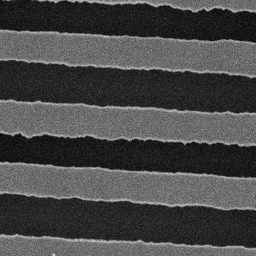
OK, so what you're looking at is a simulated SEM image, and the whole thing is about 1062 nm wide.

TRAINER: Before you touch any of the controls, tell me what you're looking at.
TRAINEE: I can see lines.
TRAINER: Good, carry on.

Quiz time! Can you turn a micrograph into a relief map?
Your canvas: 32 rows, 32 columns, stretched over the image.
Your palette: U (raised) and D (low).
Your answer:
DDDDDDDDDDDDDDDDDDUUUUUUUUUUUUUU
DDDDDDDDDDDDDDDDDDDDDDDDDDDDDDDD
DDDDDDDDDDDDDDDDDDDDDDDDDDDDDDDD
DDDDDDDDDDDDDDDDDDDDDDDDDDDDDDDD
UUUUUUUUUUUUUDDDDDDDDDDDDDDDDDDD
UUUUUUUUUUUUUUUUUUUUUUUUUUUUUUUU
UUUUUUUUUUUUUUUUUUUUUUUUUUUUUUUU
UUUUUUUUUUUUUUUUUUUUUUUUUUUUUUUU
DDDDDDDDDDDDDDDUUUUUUUUUUUUUUUUU
DDDDDDDDDDDDDDDDDDDDDDDDDDDDDDDU
DDDDDDDDDDDDDDDDDDDDDDDDDDDDDDDD
DDDDDDDDDDDDDDDDDDDDDDDDDDDDDDDD
DDDDDDDDDDDDDDDDDDDDDDDDDDDDDDDD
UUUUUUUUUUUUUUUUUUUUDDDDDDDDDDDD
UUUUUUUUUUUUUUUUUUUUUUUUUUUUUUUU
UUUUUUUUUUUUUUUUUUUUUUUUUUUUUUUU
UUUUUUUUUUUUUUUUUUUUUUUUUUUUUUUU
DDDDDDDDDDDDDDDDDDDUUUUUUUUUUUUU
DDDDDDDDDDDDDDDDDDDDDDDDDDDDDDDD
DDDDDDDDDDDDDDDDDDDDDDDDDDDDDDDD
UUUDDDDDDDDDDDDDDDDDDDDDDDDDDDDD
UUUUUUUUUUUUUUUUUUUUDDDDDDDDDDDD
UUUUUUUUUUUUUUUUUUUUUUUUUUUUUUUU
UUUUUUUUUUUUUUUUUUUUUUUUUUUUUUUU
DDDDUUUUUUUUUUUUUUUUUUUUUUUUUUUU
DDDDDDDDDDDDDDDDDDDUUUUUUUUUUUUU
DDDDDDDDDDDDDDDDDDDDDDDDDDDDDDDD
DDDDDDDDDDDDDDDDDDDDDDDDDDDDDDDD
DDDDDDDDDDDDDDDDDDDDDDDDDDDDDDDD
UUUDDDDDDDDDDDDDDDDDDDDDDDDDDDDD
UUUUUUUUUUUUUUUUUUUUUUDDDDDDDDDD
UUUUUUUUUUUUUUUUUUUUUUUUUUUUUUUU